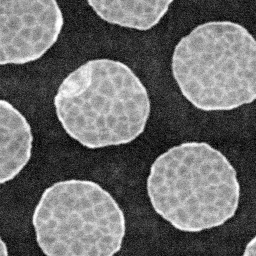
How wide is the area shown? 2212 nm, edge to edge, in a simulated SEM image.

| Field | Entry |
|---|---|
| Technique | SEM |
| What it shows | raised bodies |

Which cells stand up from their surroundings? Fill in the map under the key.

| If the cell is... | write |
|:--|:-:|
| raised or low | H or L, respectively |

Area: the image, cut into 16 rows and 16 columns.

HHHHLLHHHHLLLLLL
HHHHLLLHHHLLLHLL
HHHLLLLLLLLHHHHH
HHLLLLLLLLLHHHHH
LLLLLLHHLLLHHHHH
LLLLLHHHHLLHHHHH
LLLLHHHHHLLLHHHL
HLLLHHHHHLLLLLLL
HHLLLHHHLLLLLLLL
HHLLLLLLLLHHHHLL
HLLLLLLLLLHHHHLL
LLLLHHLLLHHHHHHL
LLLHHHHLLLHHHHHL
LLHHHHHHLLHHHHLL
LLHHHHHHLLLLLLLL
LLLHHHHLLLLLLLLH